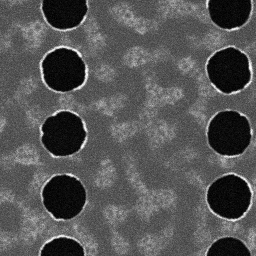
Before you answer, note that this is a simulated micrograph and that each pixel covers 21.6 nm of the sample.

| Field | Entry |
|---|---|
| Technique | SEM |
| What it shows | holes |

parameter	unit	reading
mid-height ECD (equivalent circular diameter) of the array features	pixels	44.5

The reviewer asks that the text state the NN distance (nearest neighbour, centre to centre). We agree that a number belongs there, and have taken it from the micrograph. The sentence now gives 1370 nanometres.